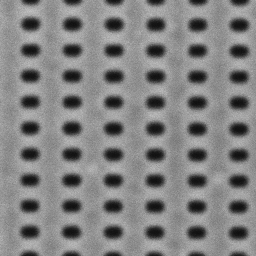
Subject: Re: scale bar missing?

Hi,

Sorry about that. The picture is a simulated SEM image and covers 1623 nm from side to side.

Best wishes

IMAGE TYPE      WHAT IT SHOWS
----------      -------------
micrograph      a regular array of holes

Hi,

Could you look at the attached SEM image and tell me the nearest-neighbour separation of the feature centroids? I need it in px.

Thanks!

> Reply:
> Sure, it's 25.8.